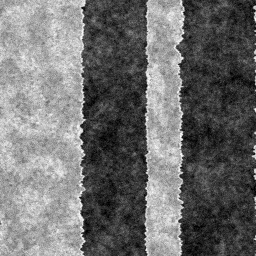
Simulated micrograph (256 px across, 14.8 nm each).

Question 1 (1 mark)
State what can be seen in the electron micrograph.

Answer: one or a few lines or trenches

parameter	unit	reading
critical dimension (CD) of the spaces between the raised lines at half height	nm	974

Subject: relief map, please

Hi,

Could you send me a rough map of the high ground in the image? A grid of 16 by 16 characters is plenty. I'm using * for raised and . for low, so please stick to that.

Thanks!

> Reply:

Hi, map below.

*****....**.....
*****....**.....
*****....**.....
*****....**.....
*****....**.....
*****....**.....
*****....**.....
*****....**.....
*****....**.....
*****....**.....
*****....**.....
*****....**.....
*****....**.....
*****....**.....
*****....**.....
*****....**.....